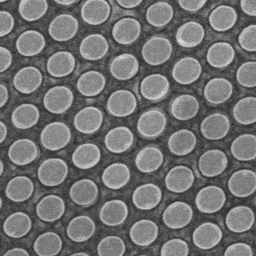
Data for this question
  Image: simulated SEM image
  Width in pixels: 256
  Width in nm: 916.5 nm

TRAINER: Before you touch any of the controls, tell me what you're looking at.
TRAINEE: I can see a regular array of raised bodies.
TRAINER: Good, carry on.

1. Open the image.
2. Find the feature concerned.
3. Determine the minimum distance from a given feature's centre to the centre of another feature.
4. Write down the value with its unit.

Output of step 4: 129 nanometers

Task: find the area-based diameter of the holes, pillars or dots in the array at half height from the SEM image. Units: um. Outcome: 0.0935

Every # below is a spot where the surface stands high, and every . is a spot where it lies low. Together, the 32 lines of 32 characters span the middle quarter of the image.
###.........######..........####
##..........######.........#####
#....####...######.........#####
....######...###....#####...####
....######..........######...###
...#######.........#######......
#...#####..........#######......
##...###....#####...#####.......
##.........#######...##.....####
##.........#######.........#####
#..........#######.........#####
.....###...######..........#####
...######...####....####...#####
...######..........######...###.
...######..........######.......
...######.........#######.......
#...####....####...#####........
#..........######...###....#####
#.........#######.........######
#.........#######.........######
....####...#####..........######
...######..####.....###....#####
..#######..........#####....##..
..#######.........######........
..######..........######........
...####.....###...######........
#.........######...###.....#####
#.........######..........######
..........######..........######
...####...######.........#######
..######...###.....####...#####.
..######..........######...###..